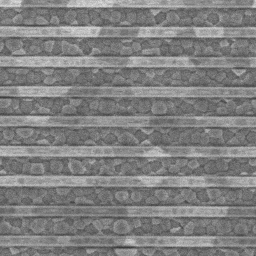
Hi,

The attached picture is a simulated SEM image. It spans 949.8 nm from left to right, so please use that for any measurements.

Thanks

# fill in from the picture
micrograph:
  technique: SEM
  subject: parallel lines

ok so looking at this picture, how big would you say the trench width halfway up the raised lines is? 80.2 nanometers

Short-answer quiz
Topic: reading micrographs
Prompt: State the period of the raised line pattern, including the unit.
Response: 111 nm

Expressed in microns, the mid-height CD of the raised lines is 0.032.